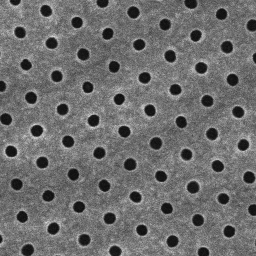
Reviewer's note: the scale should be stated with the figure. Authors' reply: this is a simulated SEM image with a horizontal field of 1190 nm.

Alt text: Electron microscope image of a regular array of holes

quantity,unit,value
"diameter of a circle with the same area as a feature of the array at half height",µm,0.0548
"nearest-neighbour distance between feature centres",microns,0.152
